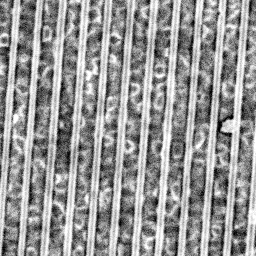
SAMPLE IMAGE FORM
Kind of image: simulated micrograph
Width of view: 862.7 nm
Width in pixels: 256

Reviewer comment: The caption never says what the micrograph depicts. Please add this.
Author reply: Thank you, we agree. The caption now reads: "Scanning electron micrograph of parallel lines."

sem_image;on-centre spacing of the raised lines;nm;76.8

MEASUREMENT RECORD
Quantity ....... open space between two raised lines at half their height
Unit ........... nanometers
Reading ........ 59.6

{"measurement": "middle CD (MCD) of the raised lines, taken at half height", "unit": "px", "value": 5.1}